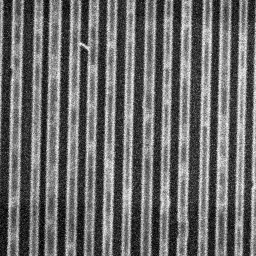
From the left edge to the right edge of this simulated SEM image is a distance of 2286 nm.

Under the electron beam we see parallel lines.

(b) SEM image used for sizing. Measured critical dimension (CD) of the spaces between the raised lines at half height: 95.9 nanometres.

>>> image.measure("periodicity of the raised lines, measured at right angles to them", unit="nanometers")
168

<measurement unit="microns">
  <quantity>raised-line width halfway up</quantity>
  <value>0.0725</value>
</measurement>